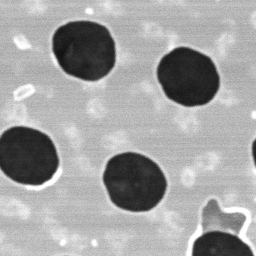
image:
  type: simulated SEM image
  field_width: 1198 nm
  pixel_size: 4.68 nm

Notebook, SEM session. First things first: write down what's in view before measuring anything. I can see holes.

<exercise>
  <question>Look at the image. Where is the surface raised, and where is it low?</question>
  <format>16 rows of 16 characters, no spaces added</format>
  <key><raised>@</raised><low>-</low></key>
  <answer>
@@@@@@@@@@@@@@@@
@@@@--@@@@@@@@@@
@@@----@@@@@@@@@
@@@----@@@---@@@
@@@@---@@@----@@
@@@@@@@@@@----@@
@@@@@@@@@@@--@@@
@@@@@@@@@@@@@@@@
---@@@@@@@@@@@@@
----@@@@@@@@@@@@
----@@@---@@@@@@
@--@@@@---@@@@@@
@@@@@@@---@@@@@@
@@@@@@@@@@@@@@@@
@@@@@@@@@@@@@-@@
@@@@@@@@@@@@----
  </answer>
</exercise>